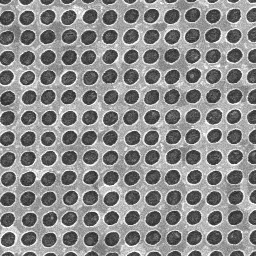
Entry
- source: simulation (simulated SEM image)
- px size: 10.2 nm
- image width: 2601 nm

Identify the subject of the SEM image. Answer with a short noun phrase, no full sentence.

a regular array of holes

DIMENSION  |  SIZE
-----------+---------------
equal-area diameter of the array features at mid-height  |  154 nm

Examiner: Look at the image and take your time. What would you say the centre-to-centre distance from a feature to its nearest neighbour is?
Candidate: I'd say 201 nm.